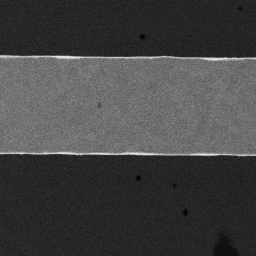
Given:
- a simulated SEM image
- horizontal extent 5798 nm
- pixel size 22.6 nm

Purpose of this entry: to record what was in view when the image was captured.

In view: wiring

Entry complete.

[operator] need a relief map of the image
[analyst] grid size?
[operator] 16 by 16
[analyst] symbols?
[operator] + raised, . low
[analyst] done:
................
................
................
+...............
++++++++++++++++
++++++++++++++++
++++++++++++++++
++++++++++++++++
++++++++++++++++
++++++++++++++++
................
................
................
................
................
................